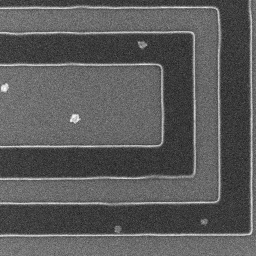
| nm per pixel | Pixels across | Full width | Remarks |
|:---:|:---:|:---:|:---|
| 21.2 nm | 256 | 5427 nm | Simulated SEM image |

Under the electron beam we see groups of lines, slits or small figures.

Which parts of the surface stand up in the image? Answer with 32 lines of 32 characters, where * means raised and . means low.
*******************************.
...........................****.
...........................****.
...........................****.
************************...****.
************************...****.
************************...****.
************************...****.
....................****...****.
....................****...****.
....................****...****.
....................****...****.
....................****...****.
....................****...****.
....................****...****.
....................****...****.
....................****...****.
....................****...****.
************************...****.
************************...****.
************************...****.
************************...****.
...........................****.
...........................****.
...........................****.
*************..****************.
*******************************.
*******************************.
*******************************.
................................
................................
................................